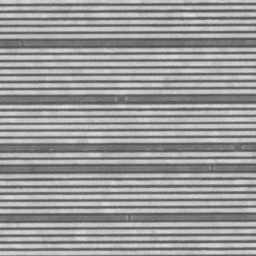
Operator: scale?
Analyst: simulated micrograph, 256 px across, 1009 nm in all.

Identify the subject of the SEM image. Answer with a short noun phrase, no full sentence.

parallel lines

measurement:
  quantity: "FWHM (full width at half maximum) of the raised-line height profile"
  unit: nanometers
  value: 10.8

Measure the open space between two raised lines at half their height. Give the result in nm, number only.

17.7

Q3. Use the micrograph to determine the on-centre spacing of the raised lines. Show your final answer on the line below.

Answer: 27.6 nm